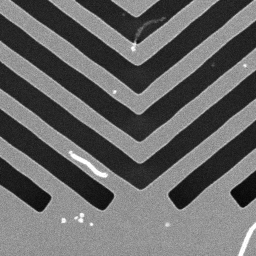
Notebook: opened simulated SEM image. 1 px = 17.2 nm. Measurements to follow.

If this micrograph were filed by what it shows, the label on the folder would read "groups of lines, slits or small figures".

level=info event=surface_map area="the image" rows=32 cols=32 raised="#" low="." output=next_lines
##.....###.....####.....###....#
###.....###.....##....####....##
.####....####........###.....###
...###.....###......###.....###.
....###.....###....###....###...
.....####....########....###....
##.....###.....#####....###....#
###.....###.....##.....###....##
.####....####........####....###
...###.....###......####....###.
....###.....####...###....####..
#....####....####.###....####...
##.....###.....#####....###.....
###.....###.....##.....###....##
.####....####.........###....###
...###.....###.......###....###.
....###.....###....###.....###..
#....####.....###.###.....###...
##.....###.....#####....####....
###.....###.....###....###.....#
.####....####.........###.....##
...###.....###.......###....####
....###.....####...####....###..
#....####....####.####....###...
##....####....#######....####...
###...#####...########..######.#
################################
################################
################################
################################
################################
################################